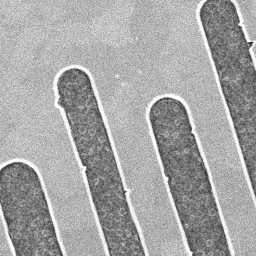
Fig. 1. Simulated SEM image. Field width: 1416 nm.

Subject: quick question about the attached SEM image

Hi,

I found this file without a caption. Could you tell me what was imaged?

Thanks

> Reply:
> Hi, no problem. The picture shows one or a few lines or trenches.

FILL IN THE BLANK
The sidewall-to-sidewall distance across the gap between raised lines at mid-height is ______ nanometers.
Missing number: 218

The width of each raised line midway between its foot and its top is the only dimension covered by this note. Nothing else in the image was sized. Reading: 228 nm